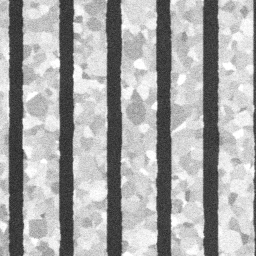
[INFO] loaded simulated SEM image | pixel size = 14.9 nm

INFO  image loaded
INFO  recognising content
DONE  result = lines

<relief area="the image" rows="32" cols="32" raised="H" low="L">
HLLHHHHLLHHHHLLHHHHLLHHHHLLHHHHH
HLLHHHHLLHHHHLLHHHHHLHHHHLLHHHHH
HLLHHHHLLHHHHLLHHHHHLHHHHLLHHHHH
HLLHHHHLLHHHHLLHHHHLLHHHHLLHHHHH
HLLHHHHLLHHHHLLHHHHLLLHHHLLHHHHH
HLLHHHHLLHHHHLLHHHHLLLHHHLLHHHHH
HLLHHHHLLHHHHLLHHHHLLLHHHLLHHHHH
HLLHHHHLLHHHHLLHHHHLLLHHHLLHHHHH
HLLHHHHLLHHHHLLHHHHLLLHHHLLHHHHH
HLLHHHHLLHHHHLLHHHHHLHHHHLLHHHHH
HLLHHHHLLHHHHLLHHHHHLHHHHLLHHHHH
HLLHHHHLLHHHHLLHHHHHLHHHHLLHHHHH
HLLHHHHLLHHHHLLHHHHHLHHHHLLHHHHH
HLLHHHHLLHHHHLLHHHHHLHHHHLLHHHHH
HLLHHHHLLHHHHLLHHHHLLHHHHLLHHHHH
HLLHHHHLLHHHHLLHHHHLLHHHHLLHHHHH
HLLHHHHLLHHHHLLHHHHHLHHHHLLHHHHH
HLLHHHHLLHHHHLLHHHHLLLHHHLLHHHHH
HLLHHHHLLHHHHLLHHHHLLLHHHLLHHHHH
HLLHHHHLLHHHHLLHHHHLLLHHHLLHHHHH
HLLHHHHLLHHHHLLHHHHHLLHHHLLHHHHH
HLLHHHHLLHHHHLLHHHHHLLHHHLLHHHHH
HLLHHHHLLHHHHLLHHHHLLLHHHLLHHHHH
HLLHHHHLLHHHHLLHHHHHLLHHHLLHHHHH
HLLHHHHLLHHHHLLHHHHHLLHHHLLHHHHH
HLLHHHHLLHHHHLLHHHHLLLHHHLLHHHHH
HLLHHHHLLHHHHLLHHHHHLLHHHLLHHHHH
HLLHHHHLLHHHHLLHHHHHLLHHHLLHHHHH
HLLHHHHLLHHHHLLHHHHHLLHHHLLHHHHH
HLLHHHHLLHHHHLLHHHHHLLHHHLLHHHHH
HLLHHHHLLHHHHLLHHHHHLLHHHLLHHHHH
HLLHHHHLLHHHHLLHHHHHLLHHHLLHHHHH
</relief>